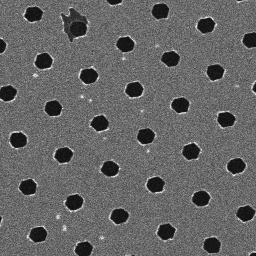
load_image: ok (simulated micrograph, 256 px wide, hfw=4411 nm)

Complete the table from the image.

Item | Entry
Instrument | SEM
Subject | a regular array of holes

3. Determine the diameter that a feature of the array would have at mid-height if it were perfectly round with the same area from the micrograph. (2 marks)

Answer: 288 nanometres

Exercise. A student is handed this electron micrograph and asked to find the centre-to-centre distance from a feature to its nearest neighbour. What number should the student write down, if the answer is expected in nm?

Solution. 819